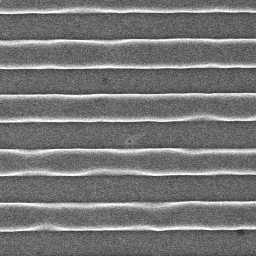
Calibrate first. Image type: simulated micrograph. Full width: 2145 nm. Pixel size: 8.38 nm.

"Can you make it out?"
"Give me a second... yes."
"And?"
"wiring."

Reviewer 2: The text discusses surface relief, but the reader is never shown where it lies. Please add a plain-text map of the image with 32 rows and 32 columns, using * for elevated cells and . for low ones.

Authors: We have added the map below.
********************************
*******............***..........
................................
................................
................................
********************************
********************************
********************************
******.*****...********.........
................................
................................
................................
********************************
********************************
********************************
................................
................................
................................
................................
********************************
********************************
*************.******************
................................
................................
................................
****.................***********
********************************
********************************
********************************
................................
................................
................................